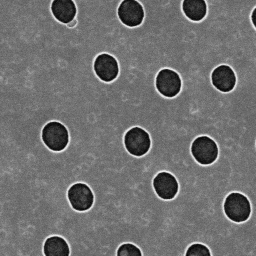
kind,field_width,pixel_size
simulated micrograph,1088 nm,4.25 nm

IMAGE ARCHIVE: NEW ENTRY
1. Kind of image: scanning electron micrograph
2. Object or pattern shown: a regular array of holes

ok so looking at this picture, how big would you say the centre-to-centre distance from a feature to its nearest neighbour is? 237 nm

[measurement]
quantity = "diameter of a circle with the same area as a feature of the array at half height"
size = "117 nanometers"